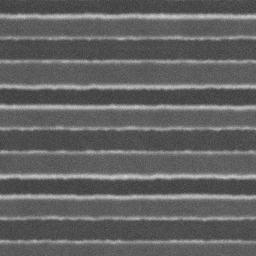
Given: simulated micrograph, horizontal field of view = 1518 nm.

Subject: lines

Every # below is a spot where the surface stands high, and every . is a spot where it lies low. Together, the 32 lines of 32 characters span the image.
................................
................................
################################
################################
################################
................................
................................
................................
################################
################################
################################
................................
................................
################################
################################
################################
................................
................................
................................
################################
################################
################################
................................
................................
................................
################################
################################
.........................#......
................................
................................
################################
################################